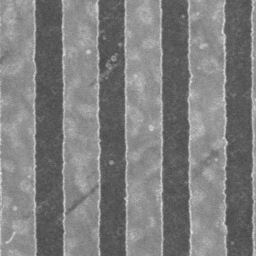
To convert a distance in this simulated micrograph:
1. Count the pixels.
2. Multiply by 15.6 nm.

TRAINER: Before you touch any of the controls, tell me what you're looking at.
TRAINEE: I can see one or a few lines or trenches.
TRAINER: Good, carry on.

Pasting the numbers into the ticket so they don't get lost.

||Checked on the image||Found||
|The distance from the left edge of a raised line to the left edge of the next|0.989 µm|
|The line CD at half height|447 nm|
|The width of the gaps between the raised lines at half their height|34.7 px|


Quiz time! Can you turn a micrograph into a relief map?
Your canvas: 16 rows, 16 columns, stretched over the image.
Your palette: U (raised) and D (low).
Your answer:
DDUUDDUUDDUUDDUU
DDUUDDUUDDUUDDUU
DDUUDDUUDDUUDDUU
DDUUDDUUDDUUDDUU
DDUUDDUUDDUUDDUU
DDUUDDUUDDUUDDUU
DDUUDDUUDDUUDDUU
DDUUDDUUDDUUDDUU
DDUUDDUUDDUUDDUU
DDUUDDUUDDUUDDUU
DDUUDDUUDDUUDDUU
DDUUDDUUDDUUDDUU
DDUUDDUUDDUUDDUU
DDUUDDUUDDUUDDUU
DDUUDDUUDDUUDDUU
DDUUDDUUDDUUDDUU